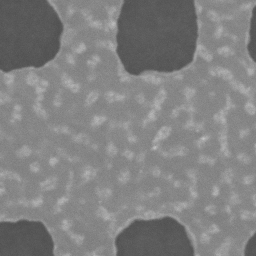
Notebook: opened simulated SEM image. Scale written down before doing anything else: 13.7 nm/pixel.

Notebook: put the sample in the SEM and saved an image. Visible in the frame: holes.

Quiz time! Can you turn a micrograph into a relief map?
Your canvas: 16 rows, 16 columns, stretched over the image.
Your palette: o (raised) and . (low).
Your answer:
...ooooo....oooo
....ooo.....oooo
....ooo.....oooo
...oooo.....oooo
oooooooo...ooooo
oooooooooooooooo
oooooooooooooooo
oooooooooooooooo
oooooooooooooooo
oooooooooooooooo
oooooooooooooooo
oooooooooooooooo
oooooooooooooooo
oooooooooo.ooooo
...ooooo....oooo
...oooo.....ooo.